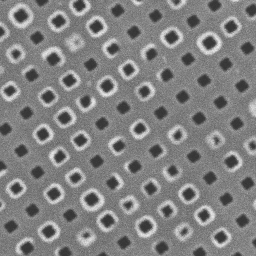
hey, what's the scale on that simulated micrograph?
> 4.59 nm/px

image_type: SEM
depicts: a regular array of holes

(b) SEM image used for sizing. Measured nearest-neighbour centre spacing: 123 nm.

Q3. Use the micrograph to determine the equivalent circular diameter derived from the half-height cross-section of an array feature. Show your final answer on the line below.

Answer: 57.4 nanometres